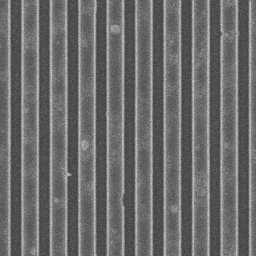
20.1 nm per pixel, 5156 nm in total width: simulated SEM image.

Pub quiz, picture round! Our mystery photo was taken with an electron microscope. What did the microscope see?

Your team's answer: parallel lines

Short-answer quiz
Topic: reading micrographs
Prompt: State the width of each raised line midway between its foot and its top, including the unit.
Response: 0.327 micrometres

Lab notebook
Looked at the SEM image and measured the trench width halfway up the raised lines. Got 254 nm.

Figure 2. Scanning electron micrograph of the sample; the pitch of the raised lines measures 572 nanometres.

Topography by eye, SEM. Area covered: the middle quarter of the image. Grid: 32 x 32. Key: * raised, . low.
*...****...****...****...****...
*...****...****...****...****...
*...****...****...****...****...
*...****...****...****...****...
*...****...****...****...****...
*...****...****...****...****...
*...****...****...****...****...
*...****...****...****...****...
*...****...****...****...****...
*...****...****...****...****...
*...****...****...****...****...
*...****...****...****...****...
*...****...****...****...****...
*...****...****...****...****...
*...****...****...****...****...
*...****...****...****...****...
*...****...****...****...****...
*...****...****...****...****...
*...****...****...****...****...
*...****...****...****...****...
*...****...****...****...****...
*...****...****...****...****...
*...****...****...****...****...
*...****...****...****...****...
*...****...****...****...****...
*...****...****...****...****...
*...****...****...****...****...
*...****...****...****...****...
*...****...****...****...****...
*...****...****...****...****...
*...****...****...****...****...
*...****...****...****...****...